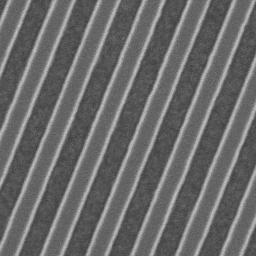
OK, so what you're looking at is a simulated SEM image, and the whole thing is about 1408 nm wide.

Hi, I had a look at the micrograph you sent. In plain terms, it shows parallel lines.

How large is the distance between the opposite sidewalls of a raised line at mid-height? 105 nm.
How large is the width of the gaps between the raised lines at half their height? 124 nm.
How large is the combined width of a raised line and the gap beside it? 230 nm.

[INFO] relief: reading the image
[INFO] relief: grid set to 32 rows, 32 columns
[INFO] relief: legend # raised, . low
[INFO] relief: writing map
.###...##...###...##...###...###
###...###...##...###...###...##.
###...##...###...###...##...###.
##...###...###...##...###...##..
##...###...##...###...##...###..
##..###...###...##...###...###..
#...###...##...###...###...##...
#...##...###...###...##...###...
...###...###...##...###...##...#
...###...##...###...##...###...#
..###...###...##...###...###...#
..###...##...###...###...##...##
..##...###...###...##...###...##
.###...###...##...###...##...###
.###...##...###...##...###...###
.##...###...##...###...###...##.
###...##...###...###...##...###.
##...###...###...##...###...##..
##...###...##...###...##...###..
##..###...###...##...###...###..
#...###...##...###...###...##...
#...##...###...###...##...###...
...###...###...##...###...##...#
...###..###...###...##...###...#
...##...###...##...###...###...#
..###...##...###...###...##...##
..##...###...###...##...###...##
.###...###...##...###...##...###
.###..###...###...##...###...###
.##...###...##...###...###...##.
###...##...###...###...##...###.
##...###...###...##...###...##..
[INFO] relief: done